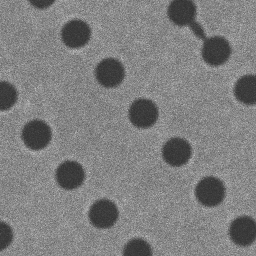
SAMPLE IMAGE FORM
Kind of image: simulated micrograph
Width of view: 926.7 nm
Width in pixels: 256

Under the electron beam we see a regular array of holes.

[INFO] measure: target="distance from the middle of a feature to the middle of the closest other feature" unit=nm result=186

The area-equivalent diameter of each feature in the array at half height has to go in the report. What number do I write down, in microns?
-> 0.109